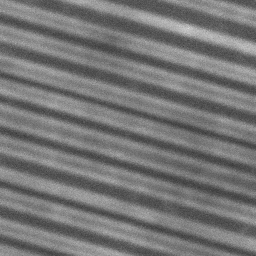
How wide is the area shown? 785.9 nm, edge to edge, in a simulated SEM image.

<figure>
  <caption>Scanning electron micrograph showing parallel lines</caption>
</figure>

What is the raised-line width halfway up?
41.8 nm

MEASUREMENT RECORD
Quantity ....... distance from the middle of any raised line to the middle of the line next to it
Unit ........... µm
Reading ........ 0.082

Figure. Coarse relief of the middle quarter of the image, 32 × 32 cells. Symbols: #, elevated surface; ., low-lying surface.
........############............
...........############.........
...............############.....
####..............############..
#######...............##########
###########..............#######
.##############..............###
.....#############..............
#.......##############..........
####........##############......
########........#############...
############.......#############
...############........#########
......#############.......######
..........############........##
##...........#############......
######...........############...
##########..........############
#############...........########
#################..........#####
....################...........#
.......#################........
...........################.....
###...........#################.
#######...........##############
##########...........###########
.#############...........#######
....##############..........####
........#############...........
...........##############.......
...............#############....
####...............#############